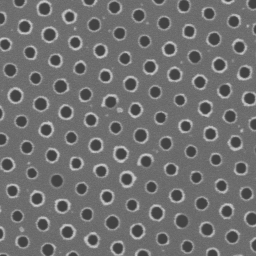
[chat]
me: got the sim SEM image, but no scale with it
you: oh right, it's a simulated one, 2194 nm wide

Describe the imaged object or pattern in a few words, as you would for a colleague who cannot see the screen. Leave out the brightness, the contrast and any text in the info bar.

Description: a regular array of holes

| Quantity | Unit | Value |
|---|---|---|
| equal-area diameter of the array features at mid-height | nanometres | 91.3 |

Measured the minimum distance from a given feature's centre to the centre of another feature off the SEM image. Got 26.1 pixels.